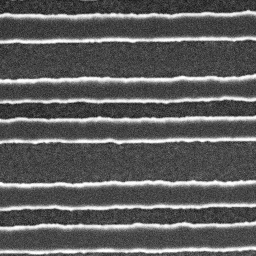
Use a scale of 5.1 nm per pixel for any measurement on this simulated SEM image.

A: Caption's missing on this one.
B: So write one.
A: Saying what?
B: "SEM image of lines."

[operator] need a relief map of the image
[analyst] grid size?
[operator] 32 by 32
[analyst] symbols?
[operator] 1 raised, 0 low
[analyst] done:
00000000000000000000000000000000
00000000000000000000000000000000
11111111111111111111111111111111
11111111111111111111111111111111
11111111111111111111111111111111
00000000000000000000000000000000
00000000000000000000000000000000
00000000000000000000000000000000
00000000000000000000000000000000
00000000000000000000000000000001
11111111111111111111111111111111
11111111111111111111111111111111
11111111111111111111111111000011
00000000000000000000000000000000
00000000000000000000000000000000
11111111111111111111111111111111
11111111111111111111111111111111
11111111111111111111111111111111
00000000000000000000000000000000
00000000000000000000000000000000
00000000000000000000000000000000
00000000000000000000000000000000
00000000000000000000000000000000
11111111111111111111111111111111
11111111111111111111111111111111
11111111111111111111111111111111
00000000000000000000000000000000
00000000000000000000000000000000
11111111111111111111111111111111
11111111111111111111111111111111
11111111111111111111111111111111
11111111110000000000000000000000